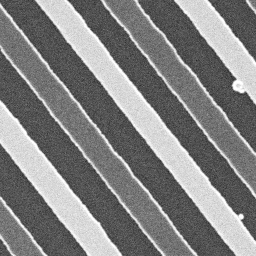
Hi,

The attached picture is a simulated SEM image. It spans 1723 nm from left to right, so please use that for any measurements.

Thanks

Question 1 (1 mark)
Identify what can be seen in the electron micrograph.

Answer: lines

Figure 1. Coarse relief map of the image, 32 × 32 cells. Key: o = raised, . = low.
.....oooo....oooo.....oooo.....o
o.....oooo....oooo.....oooo.....
oo....oooo.....oooo.....oooo....
oo.....oooo....ooooo.....oooo...
ooo.....oooo....ooooo....oooo...
oooo.....oooo....oooo.....oooo..
ooooo....oooo.....oooo.....oooo.
.oooo.....oooo.....oooo.....oooo
..oooo.....oooo....ooooo.....ooo
...oooo.....oooo....oooo.....ooo
....oooo.....oooo....oooo....ooo
....ooooo....oooo.....oooo.....o
.....oooo.....oooo....ooooo.....
o.....oooo.....oooo....oooo.....
oo.....oooo.....oooo....oooo....
oo.....ooooo.....ooo.....oooo...
ooo.....ooooo....oooo.....oooo..
oooo.....oooo.....oooo....ooooo.
.oooo.....oooo.....oooo....oooo.
.ooooo.....oooo.....oooo....oooo
..oooo.....ooooo.....ooo.....ooo
...oooo.....oooo.....oooo....ooo
....oooo.....oooo.....oooo....oo
....ooooo.....oooo.....oooo....o
.....oooo......oooo.....oooo....
o.....oooo.....ooooo....oooo....
oo.....oooo.....oooo.....oooo...
oo......oooo.....oooo.....oooo..
ooo.....ooooo.....oooo.....oooo.
oooo.....oooo.....ooooo.....ooo.
.oooo.....oooo.....oooo.....oooo
.oooo......oooo.....oooo.....ooo